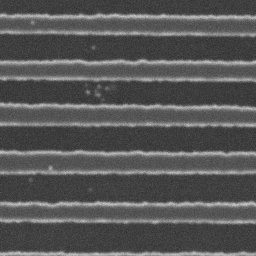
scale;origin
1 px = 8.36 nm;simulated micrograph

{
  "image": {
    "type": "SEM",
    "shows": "lines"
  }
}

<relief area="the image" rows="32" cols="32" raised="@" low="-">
--------------------------------
--------------------------------
@@@@@@@@@@@@@@@@@@@@@@@@@@@@@@@@
@@@@@@@@@@@@@@@@@@@@@@@@@@@@@@@@
--------------------------------
--------------------------------
--------------------------------
--------------------------------
@@@@@@@@@@@@@@@@@@@@@@@@@@@@@@@@
@@@@@@@@@@@@@@@@@@@@@@@@@@@@@@@@
--------------------------------
--------------------------------
--------------------------------
@@@@@@@@@@@@@@@@@@@@@@@@@@@@@@@@
@@@@@@@@@@@@@@@@@@@@@@@@@@@@@@@@
@@@@@@@@@@@@@@@@@@@@@@@@@@@@@@@@
--------------------------------
--------------------------------
--------------------------------
@@@@@@@@@@@@@@@@@@@@@@@@@@@@@@@@
@@@@@@@@@@@@@@@@@@@@@@@@@@@@@@@@
@@@@@@@@@@@@@@@@@@@@@@@@@@@@@@@@
--------------------------------
--------------------------------
--------------------------------
@@@@@@-@@@@@@@@@@@@@@@@@@@@@@@@@
@@@@@@@@@@@@@@@@@@@@@@@@@@@@@@@@
@@@@@@@@@@@@@@@@@@@@@@@@@@@@@@@@
--------------------------------
--------------------------------
--------------------------------
--------------------------------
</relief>